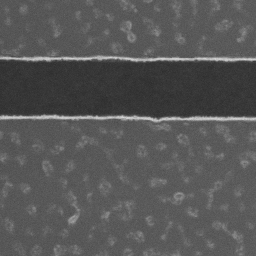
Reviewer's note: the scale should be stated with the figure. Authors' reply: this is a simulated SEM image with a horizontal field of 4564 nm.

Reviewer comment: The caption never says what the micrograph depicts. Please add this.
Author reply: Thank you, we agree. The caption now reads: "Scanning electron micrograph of one or a few lines or trenches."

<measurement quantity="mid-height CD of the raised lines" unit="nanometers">1060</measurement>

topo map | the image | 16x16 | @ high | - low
----------------
----------------
----------------
----------------
@@@@@@@@@@@@@@@@
@@@@@@@@@@@@@@@@
@@@@@@@@@@@@@@@@
----------------
----------------
----------------
----------------
----------------
----------------
----------------
----------------
----------------